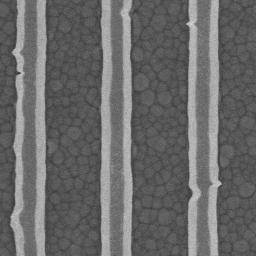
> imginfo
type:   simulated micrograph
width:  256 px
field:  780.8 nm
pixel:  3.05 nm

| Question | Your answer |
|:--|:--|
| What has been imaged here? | one or a few lines or trenches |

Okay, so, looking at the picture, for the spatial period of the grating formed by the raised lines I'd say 264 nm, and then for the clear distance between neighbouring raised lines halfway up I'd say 196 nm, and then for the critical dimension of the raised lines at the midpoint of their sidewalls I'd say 69.5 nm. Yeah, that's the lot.